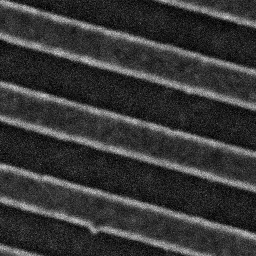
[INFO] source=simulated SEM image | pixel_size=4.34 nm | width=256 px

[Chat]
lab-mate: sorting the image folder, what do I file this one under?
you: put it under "one or a few lines or trenches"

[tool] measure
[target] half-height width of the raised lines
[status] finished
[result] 144 nm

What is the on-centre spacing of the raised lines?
0.343 um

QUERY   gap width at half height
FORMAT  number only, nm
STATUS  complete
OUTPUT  199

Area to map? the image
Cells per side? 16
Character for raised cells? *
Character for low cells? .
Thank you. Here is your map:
*...........****
*****...........
.********.......
....********....
........********
*..........*****
****...........*
********........
....********....
........*******.
...........*****
****...........*
********........
....*******.....
.......********.
...........*****